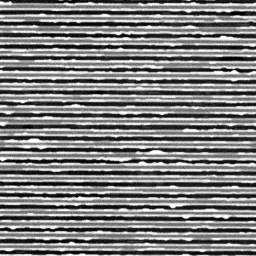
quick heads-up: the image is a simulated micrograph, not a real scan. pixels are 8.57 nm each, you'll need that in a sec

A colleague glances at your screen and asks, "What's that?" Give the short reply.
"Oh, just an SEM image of parallel lines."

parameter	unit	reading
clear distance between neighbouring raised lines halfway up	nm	37.5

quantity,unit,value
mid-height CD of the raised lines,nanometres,58.9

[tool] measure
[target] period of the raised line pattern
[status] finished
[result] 98 nm